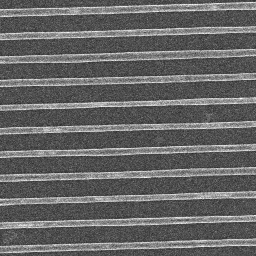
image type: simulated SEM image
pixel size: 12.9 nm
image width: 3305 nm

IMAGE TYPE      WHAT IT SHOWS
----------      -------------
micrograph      parallel lines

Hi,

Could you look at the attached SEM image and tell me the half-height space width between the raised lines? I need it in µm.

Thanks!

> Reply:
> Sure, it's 0.224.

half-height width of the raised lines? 0.0855 um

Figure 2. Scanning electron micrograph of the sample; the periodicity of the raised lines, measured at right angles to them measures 0.305 µm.